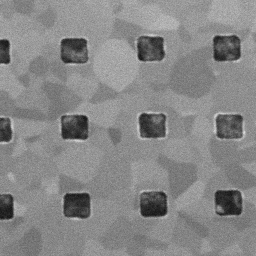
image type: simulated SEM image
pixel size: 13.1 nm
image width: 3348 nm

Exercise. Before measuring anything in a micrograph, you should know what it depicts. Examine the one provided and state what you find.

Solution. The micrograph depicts a regular array of holes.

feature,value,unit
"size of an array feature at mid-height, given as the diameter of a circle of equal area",388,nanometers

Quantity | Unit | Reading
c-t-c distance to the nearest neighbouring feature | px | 76.2